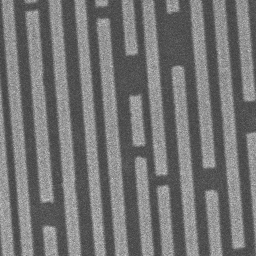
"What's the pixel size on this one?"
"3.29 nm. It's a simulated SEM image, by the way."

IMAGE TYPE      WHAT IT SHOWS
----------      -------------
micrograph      parallel lines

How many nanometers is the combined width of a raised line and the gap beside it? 76.7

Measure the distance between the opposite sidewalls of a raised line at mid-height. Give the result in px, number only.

11.2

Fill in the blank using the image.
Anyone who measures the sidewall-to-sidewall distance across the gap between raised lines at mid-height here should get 39.7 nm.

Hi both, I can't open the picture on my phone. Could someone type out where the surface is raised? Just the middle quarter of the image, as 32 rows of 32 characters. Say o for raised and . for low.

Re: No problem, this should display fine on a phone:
....oo...ooo.........oo.....o...
....ooo..ooo.........ooo...ooo..
....ooo..ooo.........ooo...ooo..
....ooo..ooo.........ooo...ooo..
o...ooo...oo.........ooo...ooo..
o....oo...oo.........ooo...ooo..
o....oo...ooo........ooo...ooo..
o....oo...ooo........ooo...ooo..
o....oo...ooo....oo...oo....oo..
o....oo...ooo....oo...oo....oo..
o....oo...ooo....oo...ooo...ooo.
o....oo...ooo....oo...ooo...ooo.
o....oo...ooo....ooo..ooo...ooo.
o....ooo..ooo....ooo..ooo...ooo.
oo...ooo..ooo....ooo..ooo...ooo.
oo...ooo..ooo....ooo..ooo...ooo.
oo...ooo...oo....ooo..ooo...ooo.
oo...ooo...oo....ooo..ooo...ooo.
oo....oo...ooo...ooo..ooo...ooo.
oo....oo...ooo...ooo..ooo...ooo.
oo....oo...ooo....o...ooo....oo.
oo....oo...ooo.........oo....oo.
oo....oo...ooo.........oo....ooo
oo....oo...ooo....o....oo....ooo
oo....oo...ooo....ooo..oo....ooo
oo....oo...ooo....ooo..oo....ooo
ooo...ooo..ooo....ooo..ooo...ooo
ooo...ooo..ooo....ooo..ooo...ooo
ooo...ooo..ooo....ooo........ooo
ooo...ooo...oo....ooo........ooo
oo.....oo...oo....ooo....o...ooo
oo.....oo...ooo...ooo..ooo...ooo